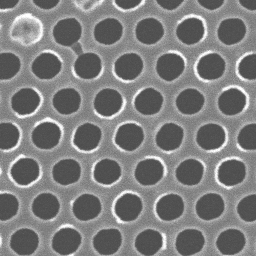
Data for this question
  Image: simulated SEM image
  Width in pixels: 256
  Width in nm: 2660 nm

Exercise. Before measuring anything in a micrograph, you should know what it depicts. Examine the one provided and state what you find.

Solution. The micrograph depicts a regular array of holes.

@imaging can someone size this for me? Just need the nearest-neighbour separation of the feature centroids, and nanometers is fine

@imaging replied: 418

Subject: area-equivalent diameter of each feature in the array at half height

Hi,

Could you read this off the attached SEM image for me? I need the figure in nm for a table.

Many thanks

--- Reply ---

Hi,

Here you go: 290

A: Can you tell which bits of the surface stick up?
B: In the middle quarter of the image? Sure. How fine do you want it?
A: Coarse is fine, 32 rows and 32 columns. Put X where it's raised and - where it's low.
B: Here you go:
XX-------XXX--------XXX-------XX
XXX------XXX--------XXX-------XX
XXX------XXXX------XXXX------XXX
XXXX---XXXXXXX----XXXXXX----XXXX
XXXXXXXXXXXXXXXXXXXXXXXXXXXXXXXX
XXXXXXXXXXXXXXXXXXXXXXXXXXXXXXXX
---XXXXXX----XXXXXXX---XXXXXXX--
----XXXX------XXXXX-----XXXXX---
----XXXX-------XXX-------XXX----
----XXXX-------XXX-------XXX----
----XXXX------XXXX------XXXX----
----XXXX------XXXX------XXXXX---
--XXXXXXX----XXXXXX----XXXXXXX--
XXXXXXXXXXXXXXXXXXXXXXXXXXXXXXXX
XXXXXXXXXXXXXXXXXXXXXXXXXXXXXXXX
XXXX----XXXXXX-----XXXXXX----XXX
XXX------XXXX-------XXXX------XX
XXX------XXXX-------XXX-------XX
XX-------XXXX-------XXX-------XX
XX-------XXXX-------XXX------XXX
XXX-----XXXXXX-----XXXX------XXX
XXXX---XXXXXXXX---XXXXXXX--XXXXX
XXXXXXXXXXXXXXXXXXXXXXXXXXXXXXXX
XXXXXXXXXXXXXXXXXXXXXXXXXXXXXXXX
---XXXXX-----XXXXXX-----XXXXXX--
----XXXX------XXXX-------XXXX---
----XXX-------XXXX-------XXX----
----XXX-------XXXX-------XXX----
----XXX-------XXXX------XXXX----
---XXXXX-----XXXXXX----XXXXXX---
XXXXXXXXXXXXXXXXXXXX-XXXXXXXXXXX
XXXXXXXXXXXXXXXXXXXXXXXXXXXXXXXX